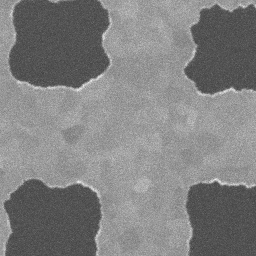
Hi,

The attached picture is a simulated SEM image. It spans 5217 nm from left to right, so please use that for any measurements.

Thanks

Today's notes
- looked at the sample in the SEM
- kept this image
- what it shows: holes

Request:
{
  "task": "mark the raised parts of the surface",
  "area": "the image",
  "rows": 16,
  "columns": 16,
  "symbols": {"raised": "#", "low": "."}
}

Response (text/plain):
#......######.#.
#......#####....
#.....######....
#......#####....
#......#####....
####.#######....
################
################
################
################
################
#..#########..##
......######....
......######....
#.....######....
......######....